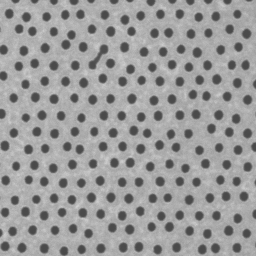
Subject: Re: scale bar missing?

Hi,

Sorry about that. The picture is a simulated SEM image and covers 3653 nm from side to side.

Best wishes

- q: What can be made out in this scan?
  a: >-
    a regular array of holes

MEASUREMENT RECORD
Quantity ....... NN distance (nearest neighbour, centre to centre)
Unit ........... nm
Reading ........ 237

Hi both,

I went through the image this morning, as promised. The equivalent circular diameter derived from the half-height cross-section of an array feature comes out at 0.137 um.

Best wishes